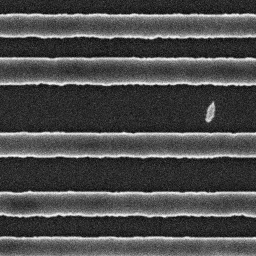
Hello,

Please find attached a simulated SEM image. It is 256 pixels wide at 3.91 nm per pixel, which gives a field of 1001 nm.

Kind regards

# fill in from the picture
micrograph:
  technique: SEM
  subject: lines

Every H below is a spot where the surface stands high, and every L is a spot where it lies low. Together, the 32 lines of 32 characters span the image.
LLLLLLLLLLLLLLLLLLLLLLLLLLLLLLLL
LLLLLLLLLLLLLLLLLLLLLLLLLLLLLLLL
HHHHHHHHHHHHHHHHHHHHHHHHHHHHHHHH
HHHHHHHHHHHHHHHHHHHHHHHHHHHHHHHH
HHHHHHHHHHLHHHHHHHHHHHHHHHHHHHHH
LLLLLLLLLLLLLLLLLLLLLLLLLLLLLLLL
LLLLLLLLLLLLLLLLLLLLLLLLLLLLLLLL
HHHHHHHHHHHHHHHHHHHHHHHHHHHHHHHH
HHHHHHHHHHHHHHHHHHHHHHHHHHHHHHHH
HHHHHHHHHHHHHHHHHHHHHHHHHHHHHHHH
HHHHHLHHHHHHHHHHHHHHHHLHHLHHHHHH
LLLLLLLLLLLLLLLLLLLLLLLLLLLLLLLL
LLLLLLLLLLLLLLLLLLLLLLLLLLLLLLLL
LLLLLLLLLLLLLLLLLLLLLLLLLLLLLLLL
LLLLLLLLLLLLLLLLLLLLLLLLLLLLLLLL
LLLLLLLLLLLLLLLLLLLLLLLLLLLLLLLL
LLLLLLLLLLLLLLLLLLLLLLLLLLLLLLLL
HHHHHHHHHHHHHHHHHHHHHHHHHHHHHHHH
HHHHHHHHHHHHHHHHHHHHHHHHHHHHHHHH
HLHHHHHLHHHHHHHHHHHHHHHHHHHHHHHH
LLLLLLLLLLLLLLLLLLLLLLLLLLLLLLLL
LLLLLLLLLLLLLLLLLLLLLLLLLLLLLLLL
LLLLLLLLLLLLLLLLLLLLLLLLLLLLLLLL
LLLLLLLLLLLLLLLLLLLLLLLLLLLLLLLL
HHHHHHHHHHHHHHHHHHHHHHHHHHHHHHHH
HHHHHHHHHHHHHHHHHHHHHHHHHHHHHHHH
HHHHHHHHHHHHHHHHHHHHHHHHHHHHHHHH
LLLLLLLLLLLLLLLLLLLLLLLLLLLLLLLL
LLLLLLLLLLLLLLLLLLLLLLLLLLLLLLLL
LLLLLLLLLLLLLLLLLLLLLLLLLLLLLLLL
HHHHHHHHHHHHHHHHHHHHHHHHHHHHHHHH
HHHHHHHHHHHHHHHHHHHHHHHHHHHHHHHH